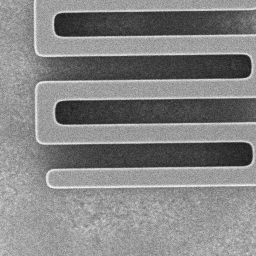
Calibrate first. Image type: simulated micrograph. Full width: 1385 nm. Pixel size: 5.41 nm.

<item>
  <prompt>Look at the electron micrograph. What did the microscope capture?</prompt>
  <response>groups of lines, slits or small figures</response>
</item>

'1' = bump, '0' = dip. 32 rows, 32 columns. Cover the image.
00001111111111111111111111111111
00001111111100000000000000000000
00001110000000000000000000000000
00001110000000000000000000000000
00001110000000000000000000111111
00001111111111111111111111111111
00000111111111111111111111111111
00000000000000000000000000000001
00000000000000000000000000000001
00000000000000000000000000000001
00000111111111111111111111111111
00001111111111111111111111111111
00001111000000000000000000000000
00001110000000000000000000000000
00001110000000000000000000000000
00001111000000000000011111111111
00001111111111111111111111111111
00000111111111111111111111111111
00000000000000000000000000000000
00000000000000000000000000000000
00000000000000000000000000000001
00000011111111111111111111111111
00000011111111111111111111111111
00000001100000000000000000000000
00000000000000000000000000000000
00000000000000000000000000000000
00000000000000000000000000000000
00000000000000000000000000000000
00000000000000000000000000000000
00000000000000000000000000000000
00000000000000000000000000000000
00000000000000000000000000000000